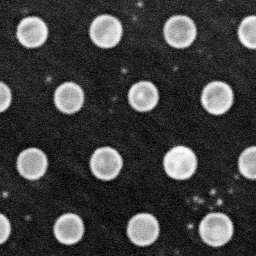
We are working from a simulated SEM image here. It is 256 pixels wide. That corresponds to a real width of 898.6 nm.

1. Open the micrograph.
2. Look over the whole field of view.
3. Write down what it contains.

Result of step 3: a regular array of raised bodies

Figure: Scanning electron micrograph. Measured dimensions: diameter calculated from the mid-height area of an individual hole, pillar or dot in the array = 105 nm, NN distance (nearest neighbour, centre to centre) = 259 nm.